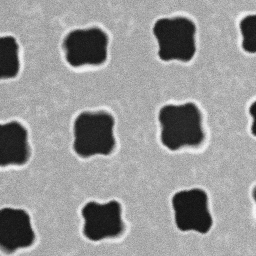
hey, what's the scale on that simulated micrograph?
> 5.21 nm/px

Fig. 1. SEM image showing holes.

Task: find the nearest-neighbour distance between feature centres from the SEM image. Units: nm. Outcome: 452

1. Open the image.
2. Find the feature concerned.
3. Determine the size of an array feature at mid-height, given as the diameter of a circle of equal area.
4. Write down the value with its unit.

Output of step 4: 44.4 px